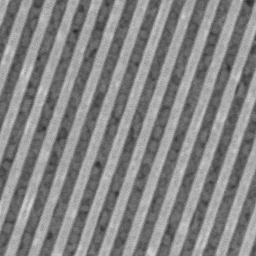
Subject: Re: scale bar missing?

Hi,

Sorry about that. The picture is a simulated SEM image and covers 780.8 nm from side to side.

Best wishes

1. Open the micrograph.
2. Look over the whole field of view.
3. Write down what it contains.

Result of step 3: parallel lines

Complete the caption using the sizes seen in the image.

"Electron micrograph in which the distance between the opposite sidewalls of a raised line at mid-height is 0.0285 microns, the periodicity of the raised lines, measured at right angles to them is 67.4 nanometres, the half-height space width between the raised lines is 38.9 nm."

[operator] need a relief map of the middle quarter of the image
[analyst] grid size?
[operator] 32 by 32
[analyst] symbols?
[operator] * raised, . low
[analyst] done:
.***...***...***...***...**....*
.***...**....**....**....**...**
.**....**...***...***...***...**
***...***...***...***...**....**
***...**....**....**....**...***
**....**...***...***...***...***
**...***...***...***...**....**.
**...**....**....**...***...***.
*....**...***...***...***...***.
*...***...**....**....**....**..
....**....**....**...***...***..
....**...***...***...***...**...
...***...**....***...**....**...
...**....**....**....**...***...
..***...***...***...***...**....
..***...**....**....**....**...*
..**....**....**....**...***...*
.***...***...***...***...**....*
.***...**....**....**....**...**
.**....**....**...***...***...**
***...***...***...***...**....**
***...**....**....**....**...***
**....**....**...***...***...***
**...***...***...***...**....**.
**...**....**....**....**...***.
*....**...***...***...***...***.
*...***...***...***...**....**..
*...**....**....**....**...***..
....**...***...***...***...***..
...***...***...***...**....**...
...**....**....**....**...***...
...**....**...***...***...**....